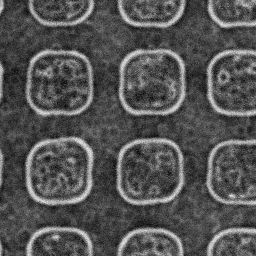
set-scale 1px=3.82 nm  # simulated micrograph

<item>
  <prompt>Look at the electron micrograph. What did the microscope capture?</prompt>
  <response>raised bodies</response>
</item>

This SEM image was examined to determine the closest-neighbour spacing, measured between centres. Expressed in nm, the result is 338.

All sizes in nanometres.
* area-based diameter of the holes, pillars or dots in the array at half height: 257